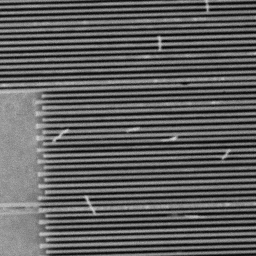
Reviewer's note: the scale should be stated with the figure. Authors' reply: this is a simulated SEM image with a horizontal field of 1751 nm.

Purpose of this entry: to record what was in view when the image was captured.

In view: parallel lines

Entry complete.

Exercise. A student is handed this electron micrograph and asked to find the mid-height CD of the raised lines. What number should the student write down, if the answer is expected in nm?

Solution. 23.1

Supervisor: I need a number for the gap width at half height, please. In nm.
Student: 17.1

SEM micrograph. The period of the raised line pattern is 41.1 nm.